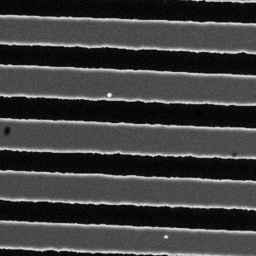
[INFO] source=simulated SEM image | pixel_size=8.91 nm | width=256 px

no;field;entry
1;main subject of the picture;lines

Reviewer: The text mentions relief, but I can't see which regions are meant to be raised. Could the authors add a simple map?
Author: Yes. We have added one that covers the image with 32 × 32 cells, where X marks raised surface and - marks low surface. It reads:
--------------------------------
--------------------------------
XXXXXXXXXXXXXXXXX---------------
XXXXXXXXXXXXXXXXXXXXXXXXXXXXXXXX
XXXXXXXXXXXXXXXXXXXXXXXXXXXXXXXX
-XXXXXXXXXXXXXXXXXXXXXXXXXXXXXXX
--------------------------XXXXXX
--------------------------------
XXXXXXXXXX----------------------
XXXXXXXXXXXXXXXXXXXXXXXXXXXXXXXX
XXXXXXXXXXXXXXXXXXXXXXXXXXXXXXXX
XXXXXXXXXXXXXXXXXXXXXXXXXXXXXXXX
-----------XXXXXXXXXXXXXXXXXXXXX
--------------------------------
--------------------------------
XXXXXXXXXXXXXXXXX---------------
XXXXXXXXXXXXXXXXXXXXXXXXXXXXXXXX
XXXXXXXXXXXXXXXXXXXXXXXXXXXXXXXX
XXXXXXXXXXXXXXXXXXXXXXXXXXXXXXXX
--------------------XXX-XXXXXXXX
--------------------------------
XXXX----------------------------
XXXXXXXXXXXXXXXXXXXXXXXXXXX-----
XXXXXXXXXXXXXXXXXXXXXXXXXXXXXXXX
XXXXXXXXXXXXXXXXXXXXXXXXXXXXXXXX
------------XXXXXXXXXXXXXXXXXXXX
--------------------------------
--------------------------------
XXXXXXXXXXXXXXXXXXXXX-----------
XXXXXXXXXXXXXXXXXXXXXXXXXXXXXXXX
XXXXXXXXXXXXXXXXXXXXXXXXXXXXXXXX
---------XXXXXXXXXXXXXXXXXXXXXXX